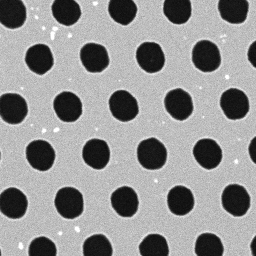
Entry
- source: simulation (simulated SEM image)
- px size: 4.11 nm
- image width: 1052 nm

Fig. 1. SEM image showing a regular array of holes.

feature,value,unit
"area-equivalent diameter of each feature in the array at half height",120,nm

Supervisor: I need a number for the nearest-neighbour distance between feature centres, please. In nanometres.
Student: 225